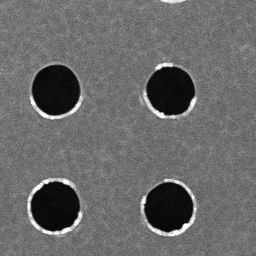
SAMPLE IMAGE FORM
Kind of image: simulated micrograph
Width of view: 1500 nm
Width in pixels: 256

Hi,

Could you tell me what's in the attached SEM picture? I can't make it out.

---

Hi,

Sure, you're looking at holes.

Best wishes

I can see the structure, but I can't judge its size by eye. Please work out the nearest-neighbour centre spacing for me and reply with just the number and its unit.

0.668 micrometres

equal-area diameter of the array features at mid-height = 288 nm